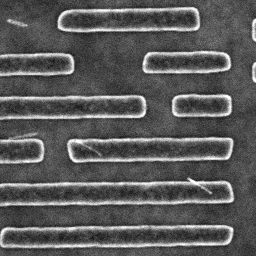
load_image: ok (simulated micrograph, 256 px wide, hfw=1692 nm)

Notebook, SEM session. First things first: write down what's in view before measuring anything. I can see wiring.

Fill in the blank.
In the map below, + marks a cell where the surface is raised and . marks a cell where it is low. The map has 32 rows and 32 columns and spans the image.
................................
........+++++++++++++++++.......
.......++++++++++++++++++.......
........++++++++++++++++........
................................
................................
................................
+++++++++.........+++++++++++...
+++++++++.........++++++++++....
................................
................................
................................
++++++++++++++++++....+++++++...
++++++++++++++++++....+++++++...
++++++++++++++++++..............
................................
................................
.................+.+++.++++++...
+++++....++++++++++++++++++++...
+++++....+++++++++++++++++++....
................................
................................
................................
+++++++++++++++++++++++++++++...
+++++++++++++++++++++++++++++...
+...............................
................................
................................
.........++++.+++++++++++++++...
+++++++++++++++++++++++++++++...
++++++++++++++++++++++..........
................................